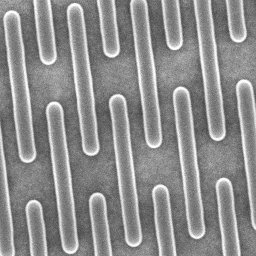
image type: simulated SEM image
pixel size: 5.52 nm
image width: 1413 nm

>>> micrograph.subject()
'groups of lines, slits or small figures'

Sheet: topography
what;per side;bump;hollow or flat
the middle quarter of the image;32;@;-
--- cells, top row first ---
---@@@-------------@@@----------
---@@@-------------@@@@---------
---@@@@------------@@@@---------
---@@@@------------@@@@---------
---@@@@------------@@@@---------
---@@@@------------@@@@---------
---@@@@------------@@@@-----@@--
---@@@@------------@@@@-----@@@-
---@@@@-----@@@-----@@@-----@@@-
----@@@-----@@@-----@@@-----@@@-
----@@@-----@@@-----@@@-----@@@-
----@@@-----@@@-----@@@@----@@@@
----@@@@----@@@@----@@@@----@@@@
----@@@@----@@@@----@@@@----@@@@
----@@@@----@@@@----@@@@----@@@@
----@@@@----@@@@----@@@@----@@@@
----@@@@-----@@@----@@@@----@@@@
-----@@@-----@@@----@@@@----@@@@
-----@@@-----@@@-----@@@-----@@@
-----@@@-----@@@-----@@@-----@@@
-----@@@@----@@@------@------@@@
@----@@@-----@@@@------------@@@
@-----@------@@@@------------@@@
@------------@@@@------------@@@
@------------@@@@------------@@@
@------------@@@@-------------@@
@------------@@@@-------------@@
@-------------@@@-------------@@
@@------------@@@@------------@@
@@------------@@@@------------@@
@@------------@@@@-----@@-----@@
@@------------@@@@-----@@@----@@